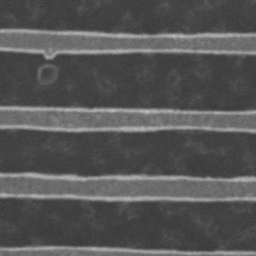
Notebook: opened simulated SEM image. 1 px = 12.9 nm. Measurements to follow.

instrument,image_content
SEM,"one or a few lines or trenches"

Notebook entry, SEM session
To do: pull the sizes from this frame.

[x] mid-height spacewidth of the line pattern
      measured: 0.678 um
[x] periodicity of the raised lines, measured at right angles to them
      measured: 935 nm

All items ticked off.